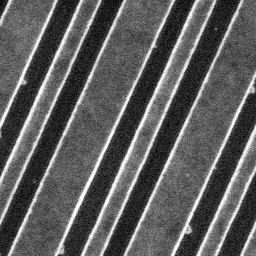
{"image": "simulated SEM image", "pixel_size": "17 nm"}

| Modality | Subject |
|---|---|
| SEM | lines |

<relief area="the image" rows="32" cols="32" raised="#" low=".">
.######...##...#######..###...##
######...###...######...##....##
######...###..#######..###...###
######...##...######...##....###
#####...###..#######...##...####
#####...##...######...###...####
####...###...######...##...#####
####...##...######...###...#####
###...###...######...##...######
###...##...######...###...######
##...###...######...##...#######
##...##...######...###...######.
##..###...######...##...#######.
#...###..#######..###...######..
#...##...######...###...######..
...###..#######...##...######...
...##...######...###...######...
..###...######...##...######...#
..##...######...###...######...#
.###...######...##...######...##
.##...######...###...######...##
###...######...##...######...###
###..######...###...######...##.
##...######...###..#######..###.
##..######....##...######...###.
#...######...###..#######...##..
#..#######...##...######...###..
...######...###...######...##...
...######...##...######...###...
..######...###...######...##...#
..######...##...######...###...#
.######...###...######...##...##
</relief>